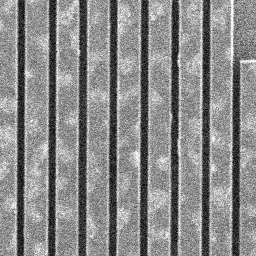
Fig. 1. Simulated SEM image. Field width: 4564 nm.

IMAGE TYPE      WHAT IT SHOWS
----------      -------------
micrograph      parallel lines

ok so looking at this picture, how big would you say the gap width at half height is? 156 nanometres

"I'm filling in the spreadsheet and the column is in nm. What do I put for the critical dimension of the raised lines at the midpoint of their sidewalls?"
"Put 388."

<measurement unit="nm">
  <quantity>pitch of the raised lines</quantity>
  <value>548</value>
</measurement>